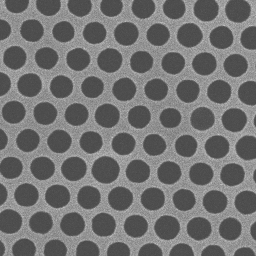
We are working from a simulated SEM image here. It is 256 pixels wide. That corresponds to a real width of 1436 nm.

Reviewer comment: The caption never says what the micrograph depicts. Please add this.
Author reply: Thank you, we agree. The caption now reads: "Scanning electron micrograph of a regular array of holes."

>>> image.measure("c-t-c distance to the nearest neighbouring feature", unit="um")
0.174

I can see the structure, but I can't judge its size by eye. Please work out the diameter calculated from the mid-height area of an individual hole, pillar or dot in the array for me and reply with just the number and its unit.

0.132 micrometres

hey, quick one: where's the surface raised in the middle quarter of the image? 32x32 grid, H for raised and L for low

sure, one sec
HLLLLLHHHLLLLLHHHLLLLLHHLLLLLLHH
HHLLLHHHHHLLLHHHHLLLLHHHHLLLLHHH
HHHHHHHHHHHHHHHHHHHHHHHHHHHLHHHH
LHHHHHLLLHHHHHHLHHHHHHHHHHHHHHHH
LLHHHLLLLLHHHLLLLHHHHLLLLHHHHLLL
LLHHLLLLLLHHLLLLLLHHLLLLLLHHLLLL
LLHHLLLLLLHHLLLLLLHHLLLLLLHHLLLL
LLHHHLLLLHHHLLLLLLHHLLLLLLHHLLLL
HHHHHHLLHHHHHLLLLHHHHLLLLHHHHLLL
HHHHHHHHHHHHHHHHHHHHHHHHHHHHHHLL
HLLLLHHHHLLLLHHHHHLLHHHHHHHHHHHH
LLLLLLHHLLLLLLHHHLLLLHHHHLLLHHHH
LLLLLLHHLLLLLLHHLLLLLLHHLLLLLHHH
LLLLLLHHLLLLLLHHLLLLLLHHLLLLLHHH
HLLLLHHHLLLLLHHHLLLLLHHHLLLLLHHH
HHHHHHHHHLLLLHHHHLLLLHHHHLLLHHHH
HHHHHHHHHHHHHHHHHHHHHHHHHHHHHHHH
LHHHHLLLLHHHHHLLHHHHHHLHHHHHHHHH
LLHHLLLLLHHHLLLLLHHHLLLLLHHHHLLL
LLHHLLLLLLHHLLLLLLHHLLLLLHHHLLLL
LLHHLLLLLLHHLLLLLLHHLLLLLLHHLLLL
LHHHHLLLLHHHLLLLLHHHLLLLLHHHLLLL
HHHHHHLHHHHHHLLLHHHHHLLLHHHHHLLL
HLLLHHHHHLLLHHHHHHHHHHHHHHHHHHHH
LLLLLHHHLLLLLHHHHLLLHHHHHLLHHHHH
LLLLLLHLLLLLLLHHLLLLLHHHLLLLLHHH
LLLLLLHLLLLLLLHLLLLLLLHLLLLLLHHH
LLLLLHHLLLLLLLHLLLLLLLHLLLLLLHHL
LLLLLHHHLLLLLHHHLLLLLHHHLLLLLHHL
HHHHHHHHHLLLHHHHHHLLHHHHLLLLHHHH
HHHHHLHHHHHHHHHHHHHHHHHHHHHHHHHH
LHHHLLLLHHHHLLLLHHHHLLLLHHHHHLLL